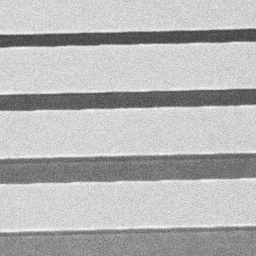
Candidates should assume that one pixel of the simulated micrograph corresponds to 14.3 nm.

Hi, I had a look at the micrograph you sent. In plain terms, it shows lines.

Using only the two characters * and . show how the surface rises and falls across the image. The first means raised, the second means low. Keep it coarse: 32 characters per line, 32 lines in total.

********************************
********************************
********************************
*******************************.
................................
......................**********
********************************
********************************
********************************
********************************
********************************
**************..................
................................
...................*************
********************************
********************************
********************************
********************************
********************************
************....................
................................
................................
.........................*******
********************************
********************************
********************************
********************************
********************************
****************.*..............
................................
................................
................................